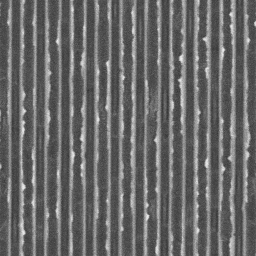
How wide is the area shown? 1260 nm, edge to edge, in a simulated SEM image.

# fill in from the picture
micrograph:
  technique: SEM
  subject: parallel lines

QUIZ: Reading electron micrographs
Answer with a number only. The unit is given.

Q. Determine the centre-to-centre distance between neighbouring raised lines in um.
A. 0.122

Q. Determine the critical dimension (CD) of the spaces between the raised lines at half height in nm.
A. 47.9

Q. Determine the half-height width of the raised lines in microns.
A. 0.0725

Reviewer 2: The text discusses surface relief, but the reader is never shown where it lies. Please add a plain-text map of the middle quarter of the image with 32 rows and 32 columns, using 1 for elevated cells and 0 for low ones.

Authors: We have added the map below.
00111000111000111100111100011100
00111000111000111100011100011100
00111000111000111100011100011100
00111000111000111100011100011100
00111000111000111100011100011100
00111000111000111100011100011100
00111000111000111100011100011100
00111000111000111100111100011100
00111000111000111100111100011100
00111000111000111100111100011100
00111000111000111100111100011100
00111000111000111100111100011100
00111000111000111100111100011100
00111000111000111100111100011100
00111000111000111100111100011100
00111000111000111100111100011100
00111000111000111100111100011100
00111000111000111100111100011100
00111000111000111100111100011100
00111000111000111100111100011100
00111000111000111100111100011100
00111000111000111100111100011100
00111000111000111100111100011100
00111000111000111000111100011100
00111000111000111000111100011100
00111000111000111000111100011100
00111000111000111000111100011100
00111000111000111000111100011100
00111000111000111000111100011100
00111000111000111000111100011100
00111000111000111000111100011100
00111000111000111000111100011100